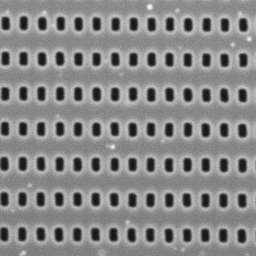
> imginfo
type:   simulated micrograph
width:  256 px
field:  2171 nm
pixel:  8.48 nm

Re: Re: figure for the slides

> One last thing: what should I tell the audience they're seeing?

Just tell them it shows a regular array of holes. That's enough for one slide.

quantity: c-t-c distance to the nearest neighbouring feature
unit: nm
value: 153